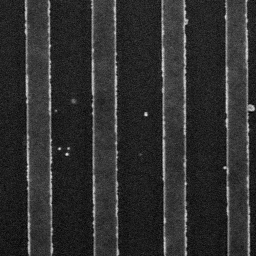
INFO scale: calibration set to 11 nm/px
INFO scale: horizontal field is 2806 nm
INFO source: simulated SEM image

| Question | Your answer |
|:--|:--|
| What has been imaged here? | lines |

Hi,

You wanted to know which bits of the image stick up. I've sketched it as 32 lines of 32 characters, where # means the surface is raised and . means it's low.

...###......##......###.....###.
...###......##......###.....###.
...###......##......###.....###.
...###......##......###.....###.
...###......##......###.....###.
...###......##......###.....###.
...###......###.....###.....###.
...###......###.....###.....###.
...###......###.....###.....###.
...###......###.....###.....###.
...###......###.....###.....###.
...###......###.....###.....###.
...###......###.....###.....###.
...###......###.....###.....###.
...###......###.....###.....###.
...###......###.....###.....###.
...###......###.....###.....###.
...###......###.....###.....###.
...###......###.....###.....###.
...###......###.....###.....###.
...###......###.....###.....###.
...###......###......##.....###.
....##......###......##.....###.
....##......###......##.....###.
....##......###......##.....###.
....##......###......##.....###.
....##......###......##......##.
....##......###......##......##.
....##......###......##......##.
....##......###......##......##.
....###.....###......##......##.
....###.....###......##......##.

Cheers